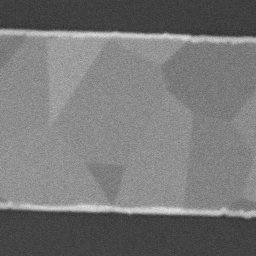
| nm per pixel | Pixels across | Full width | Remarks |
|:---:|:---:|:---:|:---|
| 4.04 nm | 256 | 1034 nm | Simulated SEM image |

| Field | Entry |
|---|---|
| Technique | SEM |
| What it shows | one or a few lines or trenches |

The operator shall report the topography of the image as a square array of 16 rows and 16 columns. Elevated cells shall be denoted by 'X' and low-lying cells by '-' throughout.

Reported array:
----------------
----------------
XXXXXXXXXXXXXXXX
XXXXXXXXXXXXXXXX
XXXXXXXXXXXXXXXX
XXXXXXXXXXXXXXXX
XXXXXXXXXXXXXXXX
XXXXXXXXXXXXXXXX
XXXXXXXXXXXXXXXX
XXXXXXXXXXXXXXXX
XXXXXXXXXXXXXXXX
XXXXXXXXXXXXXXXX
XXXXXXXXXXXXXXXX
----------------
----------------
----------------